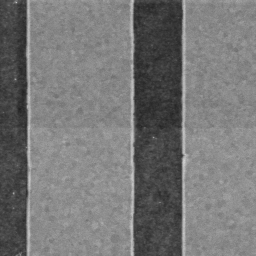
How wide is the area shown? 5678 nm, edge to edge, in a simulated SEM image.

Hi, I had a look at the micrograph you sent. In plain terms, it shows one or a few lines or trenches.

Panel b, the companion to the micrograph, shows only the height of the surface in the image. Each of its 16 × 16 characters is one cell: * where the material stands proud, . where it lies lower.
..******....****
..******....****
..******....****
..******....****
..******....****
..******....****
..******....****
..******...*****
..******....****
..******....****
..******....****
..******....****
..******....****
..******....****
..******....****
..******....****